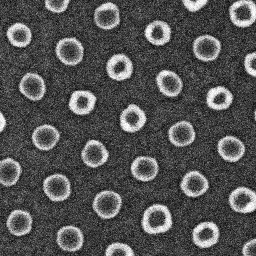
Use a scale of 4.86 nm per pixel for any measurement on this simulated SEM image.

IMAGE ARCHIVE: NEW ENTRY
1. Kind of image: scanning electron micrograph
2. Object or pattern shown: a regular array of raised bodies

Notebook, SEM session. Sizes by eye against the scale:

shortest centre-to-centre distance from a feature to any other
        249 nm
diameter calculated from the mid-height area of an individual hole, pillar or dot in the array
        24.4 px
